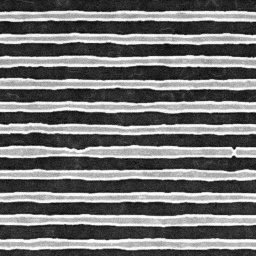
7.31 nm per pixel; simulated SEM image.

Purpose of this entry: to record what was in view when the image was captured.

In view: parallel lines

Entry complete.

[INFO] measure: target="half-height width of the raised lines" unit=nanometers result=55.7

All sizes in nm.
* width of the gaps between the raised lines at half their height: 112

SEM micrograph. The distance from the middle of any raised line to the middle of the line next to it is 167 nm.